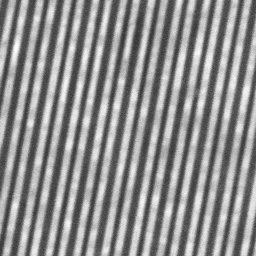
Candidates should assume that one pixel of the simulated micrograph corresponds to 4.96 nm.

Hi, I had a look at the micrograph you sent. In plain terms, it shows parallel lines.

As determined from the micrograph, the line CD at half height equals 0.0312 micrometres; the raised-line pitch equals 68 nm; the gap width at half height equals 31.8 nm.